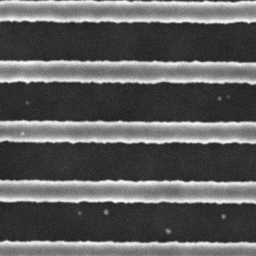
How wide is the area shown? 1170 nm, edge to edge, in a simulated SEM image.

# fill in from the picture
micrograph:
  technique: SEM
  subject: lines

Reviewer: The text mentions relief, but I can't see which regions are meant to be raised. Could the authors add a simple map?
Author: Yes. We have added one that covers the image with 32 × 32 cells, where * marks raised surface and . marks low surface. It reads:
********************************
********************************
********************************
................................
................................
................................
................................
................................
********************************
********************************
...............................*
................................
................................
................................
................................
********************************
********************************
********************************
................................
................................
................................
................................
................................
********************************
********************************
................................
................................
................................
................................
................................
********************************
********************************